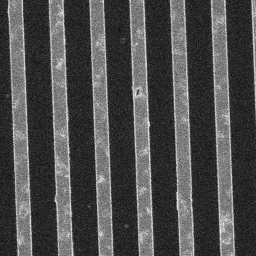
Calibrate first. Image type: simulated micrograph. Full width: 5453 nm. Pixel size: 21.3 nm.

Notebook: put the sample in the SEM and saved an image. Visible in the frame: parallel lines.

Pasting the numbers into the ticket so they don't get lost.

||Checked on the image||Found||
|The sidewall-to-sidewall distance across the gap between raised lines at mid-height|26.2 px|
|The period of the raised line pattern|864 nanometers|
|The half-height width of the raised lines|0.303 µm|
